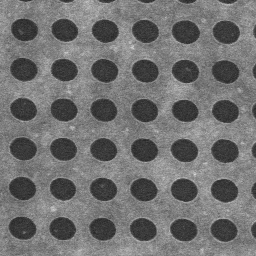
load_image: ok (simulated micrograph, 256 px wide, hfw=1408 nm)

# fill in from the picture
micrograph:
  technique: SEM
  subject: a regular array of holes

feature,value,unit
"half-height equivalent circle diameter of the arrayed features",141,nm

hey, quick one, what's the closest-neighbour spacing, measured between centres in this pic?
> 217 nanometers